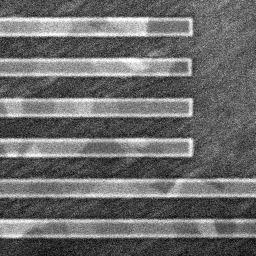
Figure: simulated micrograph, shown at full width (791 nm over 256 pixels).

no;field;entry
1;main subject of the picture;parallel lines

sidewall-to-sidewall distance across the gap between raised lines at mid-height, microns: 0.0769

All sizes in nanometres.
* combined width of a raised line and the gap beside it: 124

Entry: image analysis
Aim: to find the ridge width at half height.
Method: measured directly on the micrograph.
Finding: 48.3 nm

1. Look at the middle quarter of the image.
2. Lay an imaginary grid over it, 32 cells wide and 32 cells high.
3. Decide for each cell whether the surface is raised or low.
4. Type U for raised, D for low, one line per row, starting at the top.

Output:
UUUUUUUUUUUUUUUUUUUUUUUUUUUUUUUU
UUUUUUUUUUUUUUUUUUUUUUUUUUUUUUUU
UUUUUUUUUUUUUUUUUUUUUUUUUUUUUUUU
DDDDDDDDDDDDDDDDDDDDDDDDDDDDDDDD
DDDDDDDDDDDDDDDDDDDDDDDDDDDDDDDD
DDDDDDDDDDDDDDDDDDDDDDDDDDDDDDDD
DDDDDDDDDDDDDDDDDDDDDDDDDDDDDDDD
DDDDDDDDDDDDDDDDDDDDDDDDDDDDDDDD
DDDDDDDDDDDDDDDDDDDDDDDDDDDDDDDD
UUUUUUUUUUUUUUUUUUUUUUUUUUUUUUUU
UUUUUUUUUUUUUUUUUUUUUUUUUUUUUUUU
UUUUUUUUUUUUUUUUUUUUUUUUUUUUUUUU
UUUUUUUUUUUUUUUUUUUUUUUUUUUUUUUU
DDDDDDDDDDDDDDDDDDDDDDDDDDDDDDDD
DDDDDDDDDDDDDDDDDDDDDDDDDDDDDDDD
DDDDDDDDDDDDDDDDDDDDDDDDDDDDDDDD
DDDDDDDDDDDDDDDDDDDDDDDDDDDDDDDD
DDDDDDDDDDDDDDDDDDDDDDDDDDDDDDDD
DDDDDDDDDDDDDDDDDDDDDDDDDDDDDDDD
UUUUUUUUUUUUUUUUUUUUUUUUUUUUUUUU
UUUUUUUUUUUUUUUUUUUUUUUUUUUUUUUU
UUUUUUUUUUUUUUUUUUUUUUUUUUUUUUUU
UUUUUUUUUUUUUUUUUUUUUUUUUUUUUUUU
DDDDDDDDDDDDDDDDDDDDDDDDDDDDDDDD
DDDDDDDDDDDDDDDDDDDDDDDDDDDDDDDD
DDDDDDDDDDDDDDDDDDDDDDDDDDDDDDDD
DDDDDDDDDDDDDDDDDDDDDDDDDDDDDDDD
DDDDDDDDDDDDDDDDDDDDDDDDDDDDDDDD
DDDDDDDDDDDDDDDDDDDDDDDDDDDDDDDD
UUUUUUUUUUUUUUUUUUUUUUUUUUUUUUUU
UUUUUUUUUUUUUUUUUUUUUUUUUUUUUUUU
UUUUUUUUUUUUUUUUUUUUUUUUUUUUUUUU